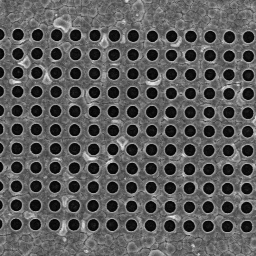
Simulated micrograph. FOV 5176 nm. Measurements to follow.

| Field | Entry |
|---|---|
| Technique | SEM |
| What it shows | a regular array of holes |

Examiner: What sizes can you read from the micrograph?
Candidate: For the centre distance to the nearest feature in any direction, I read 0.379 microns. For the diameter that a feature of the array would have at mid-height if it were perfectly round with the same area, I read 237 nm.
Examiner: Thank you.